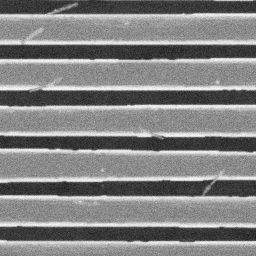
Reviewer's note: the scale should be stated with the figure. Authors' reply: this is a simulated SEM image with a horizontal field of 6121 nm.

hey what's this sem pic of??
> lines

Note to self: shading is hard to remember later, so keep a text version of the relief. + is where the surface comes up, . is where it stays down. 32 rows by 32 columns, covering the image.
................................
................................
++++++++++++++++++++++++++++++++
++++++++++++++++++++++++++++++++
++++++++++++++++++++++++++++++++
................................
................................
................................
++++++++++++++++++++++++++++++++
++++++++++++++++++++++++++++++++
++++++++++++++++++++++++++++++++
................................
................................
++++++++++++++++++++++++++++++++
++++++++++++++++++++++++++++++++
++++++++++++++++++++++++++++++++
++++++++++++++++++++++++++++++++
................................
................................
++++++++++++++++++++++++++++++++
++++++++++++++++++++++++++++++++
++++++++++++++++++++++++++++++++
++++++++........................
................................
................................
++++++++++++++++++++++++++++++++
++++++++++++++++++++++++++++++++
++++++++++++++++++++++++++++++++
................................
................................
++++++++++++++++++++++++++++++++
++++++++++++++++++++++++++++++++